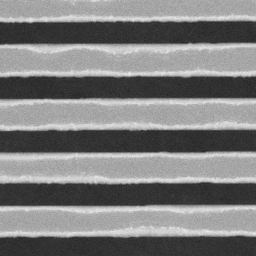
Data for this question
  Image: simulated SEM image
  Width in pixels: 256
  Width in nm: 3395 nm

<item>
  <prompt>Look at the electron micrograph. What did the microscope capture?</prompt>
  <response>lines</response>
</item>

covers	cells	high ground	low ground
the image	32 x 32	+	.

++++++++++++++++++++++++++++++++
++++++++++++++++++++++++++++++++
++++++++++++++++++++++++++++++++
................................
................................
..............................++
++++++++++++++++++++++++++++++++
++++++++++++++++++++++++++++++++
++++++++++++++++++++++++++++++++
................................
................................
................................
++++++++++++++++++++++++++++++++
++++++++++++++++++++++++++++++++
++++++++++++++++++++++++++++++++
++++++++++++++++++++++++++++++++
................................
................................
................................
++++++++++++++++++++++++++++++++
++++++++++++++++++++++++++++++++
++++++++++++++++++++++++++++++++
++++++++++++++++++++++++++++++++
................................
................................
................................
++++++++++++++++++++++++++++++++
++++++++++++++++++++++++++++++++
++++++++++++++++++++++++++++++++
++++++++++++++++++.....+......++
................................
................................